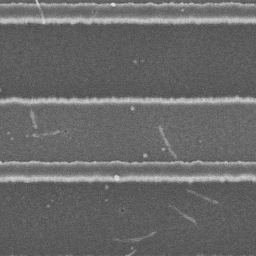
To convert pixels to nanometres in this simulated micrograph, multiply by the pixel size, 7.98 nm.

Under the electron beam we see lines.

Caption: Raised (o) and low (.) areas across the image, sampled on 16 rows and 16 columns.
oooooooooooooooo
................
................
................
................
................
oooooooooooooooo
oooooooooooooooo
oooooooooooooooo
oooooooooooooooo
oooooooooooooooo
................
................
................
................
................